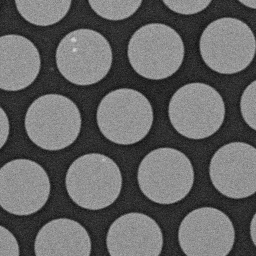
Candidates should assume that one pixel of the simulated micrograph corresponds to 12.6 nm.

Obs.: an array of small figures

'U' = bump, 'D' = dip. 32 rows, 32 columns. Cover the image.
DDUUUUUUUDDUUUUUUDDDDUUUUUDDDDUU
DDUUUUUUDDDDUUUUUDDDDDUUUDDDDDDD
DDDUUUUDDDDDDDDDDDDDDDDDDDDUUUDD
DDDDDDDDDDDDDDDDDDUUUDDDDDUUUUUD
DUDDDDDDUUUUUDDDDUUUUUDDDUUUUUUU
UUUUDDDUUUUUUUDDUUUUUUUDDUUUUUUU
UUUUUDDUUUUUUUDDUUUUUUUDDUUUUUUU
UUUUUDDUUUUUUUDDUUUUUUUDDUUUUUUD
UUUUUDDUUUUUUUDDDUUUUUDDDDUUUUUD
UUUUUDDDUUUUUDDDDDUUUDDDDDDDDDDD
UUUUDDDDDDUDDDDDDDDDDDDDUDDDDDDU
DDDDDDDDDDDDDDUUUDDDDDUUUUUDDDDU
DDDDDUUUUDDDDUUUUUDDDUUUUUUUDDUU
DDDDUUUUUUDDUUUUUUUDDUUUUUUUDDUU
UDDUUUUUUUDDUUUUUUUDDUUUUUUUDDUU
UDDUUUUUUUDDUUUUUUUDDDUUUUUUDDDU
UDDUUUUUUUDDDUUUUUDDDDUUUUUDDDDD
UDDDUUUUUDDDDDUUUDDDDDDDDDDDDDDD
DDDDDUUUDDDDDDDDDDDDDDDDDDDDUUUU
DDDDDDDDDDUUUDDDDDUUUUUDDDDUUUUU
DUUUUDDDDUUUUUDDDDUUUUUUDDUUUUUU
UUUUUUDDUUUUUUUDDUUUUUUUDDUUUUUU
UUUUUUDDUUUUUUUDDUUUUUUUDDUUUUUU
UUUUUUDDUUUUUUUDDDUUUUUUDDDUUUUU
UUUUUUDDDUUUUUUDDDUUUUUDDDDDUUUD
UUUUUDDDDDUUUUDDDDDDDDDDDDDDDDDD
DUUUDDDDDDDDDDDDDDDDDDDDUUUUDDDD
DDDDDDDUUDDDDDDUUUUDDDDUUUUUUDDD
DDDDDUUUUUDDDDUUUUUUDDUUUUUUUDDU
UUDDDUUUUUUDDUUUUUUUDDUUUUUUUDDU
UUDDUUUUUUUDDUUUUUUUDDDUUUUUUDDD
UUDDUUUUUUUDDDUUUUUUDDDUUUUUUDDD